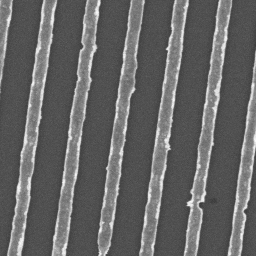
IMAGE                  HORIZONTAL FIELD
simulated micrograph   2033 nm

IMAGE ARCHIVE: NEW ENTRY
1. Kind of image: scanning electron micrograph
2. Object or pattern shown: parallel lines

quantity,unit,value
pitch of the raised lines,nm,345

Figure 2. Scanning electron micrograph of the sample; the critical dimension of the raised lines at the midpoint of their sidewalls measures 100 nanometres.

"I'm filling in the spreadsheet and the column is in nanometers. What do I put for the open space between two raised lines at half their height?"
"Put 247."